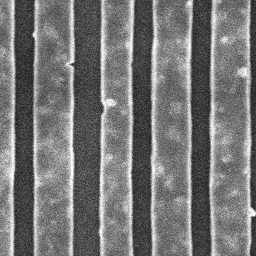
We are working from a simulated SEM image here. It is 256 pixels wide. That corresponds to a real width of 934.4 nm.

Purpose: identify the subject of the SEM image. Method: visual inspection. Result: parallel lines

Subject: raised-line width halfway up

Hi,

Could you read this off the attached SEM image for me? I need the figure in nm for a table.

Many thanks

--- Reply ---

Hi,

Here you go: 138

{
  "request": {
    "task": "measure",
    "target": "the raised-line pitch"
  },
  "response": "59 px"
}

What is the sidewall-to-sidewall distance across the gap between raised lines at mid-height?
21 pixels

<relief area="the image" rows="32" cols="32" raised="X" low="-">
XX--XXXXX----XXXX--XXXXX---XXXX-
XX--XXXXX----XXXX--XXXXX---XXXX-
XX--XXXXX----XXXX--XXXXX---XXXX-
XX--XXXXX----XXXX--XXXXX---XXXX-
XX--XXXXX----XXX---XXXXX---XXXX-
XX---XXXX----XXX---XXXXX--XXXXX-
XX--XXXXX----XXX---XXXXX--XXXXX-
XX--XXXXX----XXX---XXXXX--XXXXX-
XX--XXXXX----XXX---XXXXX--XXXXX-
XX--XXXXX----XXX---XXXXX--XXXXX-
XX--XXXXX----XXX---XXXXX--XXXXX-
XX--XXXXX----XXX---XXXXX---XXXX-
XX--XXXXX----XXX---XXXXX--XXXXX-
XX--XXXXX----XXX---XXXXX--XXXXX-
XX--XXXXX----XXX---XXXXX---XXXX-
XX--XXXXX----XXX---XXXXX--XXXXX-
XX--XXXXX----XXX---XXXXX--XXXXX-
XX--XXXXX----XXX---XXXXX--XXXXX-
XX--XXXXX----XXX---XXXXX--XXXXX-
XX--XXXXX----XXX---XXXXX--XXXXX-
XX--XXXXX----XXX---XXXXX--XXXXX-
XX--XXXXX----XXX---XXXXX--XXXXX-
XX--XXXXX----XXX---XXXXX--XXXXX-
XX--XXXXX----XXX---XXXXX--XXXXX-
X---XXXXX----XXX---XXXXX--XXXXX-
XX--XXXXX----XXX---XXXXX--XXXXX-
XX--XXXXX----XXX---XXXXX---XXXXX
XX--XXXXX----XXX---XXXXX---XXXX-
XX--XXXXX----XXX---XXXXX---XXXX-
XX--XXXXX----XXX---XXXXX---XXXX-
XX--XXXXX----XXXX--XXXXX---XXXX-
XX--XXXXX----XXXX--XXXXX---XXXX-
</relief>